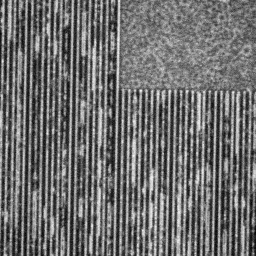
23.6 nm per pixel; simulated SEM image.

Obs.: parallel lines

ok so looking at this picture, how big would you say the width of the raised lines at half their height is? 41.3 nanometres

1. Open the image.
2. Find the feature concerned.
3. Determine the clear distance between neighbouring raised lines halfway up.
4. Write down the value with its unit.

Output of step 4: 103 nanometres